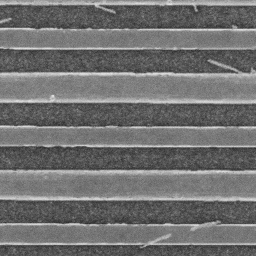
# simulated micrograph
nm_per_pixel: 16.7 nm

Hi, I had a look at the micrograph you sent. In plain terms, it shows lines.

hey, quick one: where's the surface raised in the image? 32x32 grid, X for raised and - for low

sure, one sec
---------------------X----------
--------------------------------
--------------------------------
--------------------------------
XXXXXXXXXXXXXXXXXXXXXXXXXXXXXXXX
XXXXXXXXXXXXXXXXXXXXXXXXXXXXXXXX
--------------------------------
--------------------------------
--------------------------------
XXXXXXXXXXXXXXXXXXXXXXXXXXXXXXXX
XXXXXXXXXXXXXXXXXXXXXXXXXXXXXXXX
XXXXXXXXXXXXXXXXXXXXXXXXXXXXXXXX
XXXXXXXXXXXXXXXXXXXXXXXXXXXXXXXX
--------------------------------
--------------------------------
--------------------------------
XXXXXXXXXXXXXXXXXXXXXXXXXXXXXXXX
XXXXXXXXXXXXXXXXXXXXXXXXXXXXXXXX
--------------------------------
--------------------------------
--------------------------------
----------X---------------XXXXXX
XXXXXXXXXXXXXXXXXXXXXXXXXXXXXXXX
XXXXXXXXXXXXXXXXXXXXXXXXXXXXXXXX
XXXXXXXXXXXXXXXXXXXXXXXXXXXXXXXX
--------------------------------
--------------------------------
--------------------------------
XXXXXXXXXXXXXXXXXXXXXXXXXXXXXXXX
XXXXXXXXXXXXXXXXXXXXXXXXXXXXXXXX
XXXXXXXXXXXXXXXXXXXXXXXXXXXXXXXX
--------------------------------